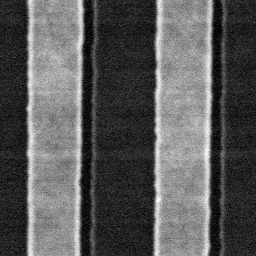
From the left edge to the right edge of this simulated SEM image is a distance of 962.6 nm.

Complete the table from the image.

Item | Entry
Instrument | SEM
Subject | lines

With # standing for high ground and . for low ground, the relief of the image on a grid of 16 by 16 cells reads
..###.....###...
..###.....###...
..###.....###...
..###.....###...
..###.....###...
..###.....###...
..###.....###...
..###.....###...
..###.....###...
..###.....###...
..###.....###...
..###.....###...
..###.....###...
..###.....###...
..###.....###...
..###.....###...